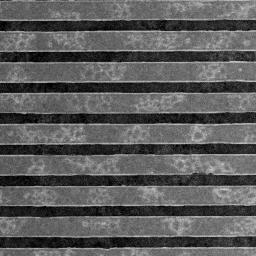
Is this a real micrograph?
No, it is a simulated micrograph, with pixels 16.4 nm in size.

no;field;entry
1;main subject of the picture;parallel lines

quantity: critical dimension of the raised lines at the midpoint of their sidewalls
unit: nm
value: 322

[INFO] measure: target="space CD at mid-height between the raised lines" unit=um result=0.185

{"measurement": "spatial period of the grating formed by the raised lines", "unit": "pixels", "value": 30.9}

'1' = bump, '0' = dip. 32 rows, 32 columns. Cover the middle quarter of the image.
11111111111111111111111111111111
11111111111111111111111111111111
11111111111111111111111111111111
11111111111111111111111111111111
00000000000000000000000000000000
00000000000000000000000000000000
00000000000000000000000000000000
11111111111111111000011111111110
11111111111111111111111111111111
11111111111111111111111111111111
11111111111111111111111111111111
11111111111111111111111111111111
00000000000000000000000000000000
00000000000000000000000000000000
00000000000000000000000000000000
11111111111111111111111111111111
11111111111111111111111111111111
11111111111111111111111111111111
11111111111111111111111111111111
11111111111111111111111111111111
00000000000000000000000000000000
00000000000000000000000000000000
00000000000000000000000000000000
11111111111111111111111111111111
11111111111111111111111111111111
11111111111111111111111111111111
11111111111111111111111111111111
11110111111111111111111111111111
00000000000000000000000000000000
00000000000000000000000000000000
00000000000000000000000000000000
11111111111111111111111111111111